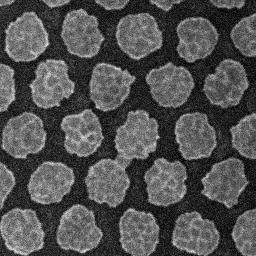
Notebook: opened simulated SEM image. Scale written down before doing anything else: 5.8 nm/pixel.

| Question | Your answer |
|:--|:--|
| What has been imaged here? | a regular array of raised bodies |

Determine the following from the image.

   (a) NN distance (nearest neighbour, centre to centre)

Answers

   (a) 316 nanometres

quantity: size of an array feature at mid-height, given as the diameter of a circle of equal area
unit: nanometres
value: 252